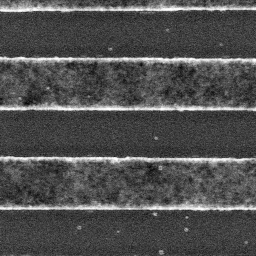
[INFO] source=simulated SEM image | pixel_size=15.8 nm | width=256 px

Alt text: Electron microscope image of lines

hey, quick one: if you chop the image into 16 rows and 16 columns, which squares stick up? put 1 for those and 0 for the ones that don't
1111111111111111
0000000000000000
0000000000000000
0000000000000000
1111111111111111
1111111111111111
1111111111111111
0000000000000000
0000000000000000
0000000000000000
1111111111111111
1111111111111111
1111111111111111
0000000000000000
0000000000000000
0000000000000000